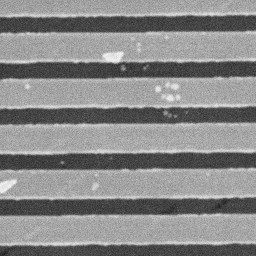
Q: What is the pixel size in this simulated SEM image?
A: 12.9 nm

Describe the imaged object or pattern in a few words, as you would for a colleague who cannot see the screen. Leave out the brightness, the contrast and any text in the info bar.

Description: lines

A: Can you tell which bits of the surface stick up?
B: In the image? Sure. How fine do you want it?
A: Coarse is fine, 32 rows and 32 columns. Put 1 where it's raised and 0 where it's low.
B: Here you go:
11111111111111111111111111111111
11111111111111111111111111111111
00000000000000000000000000000000
00000000000000000000000000000000
11111111111111111111111111111111
11111111111111111111111111111111
11111111111111111111111111111111
11111111111111111111111111111111
00000000000000000000000000000000
00000000000000000000000000000000
11111111111111111111111111111111
11111111111111111111111111111111
11111111111111111111111111111111
11100000000000000000000000000000
00000000000000000000000000000000
00000000000000000000001111111111
11111111111111111111111111111111
11111111111111111111111111111111
11111111111111111111111111111111
00000000000000000000000000000000
00000000000000000000000000000000
11111111111111111111111111111111
11111111111111111111111111111111
11111111111111111111111111111111
11111111111111111111111111111111
00000000000000000000000000000000
00000000000000000000000000000000
11111111111111111111111111111111
11111111111111111111111111111111
11111111111111111111111111111111
11111111111011101110000000000000
00000000000000000000000000000000